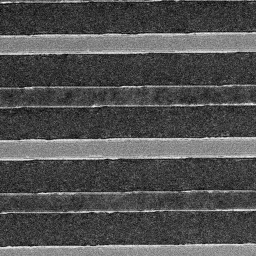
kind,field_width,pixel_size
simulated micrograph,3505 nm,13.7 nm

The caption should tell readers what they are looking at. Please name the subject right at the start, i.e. lines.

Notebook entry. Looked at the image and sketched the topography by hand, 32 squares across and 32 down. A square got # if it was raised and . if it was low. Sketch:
................................
................................
................................
................................
.....###########################
################################
#########################.#.....
................................
................................
................................
................................
################################
################################
................................
................................
................................
................................
....############################
################################
################################
................................
................................
................................
................................
################################
################################
############....................
................................
................................
................................
................................
################################